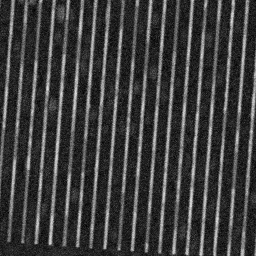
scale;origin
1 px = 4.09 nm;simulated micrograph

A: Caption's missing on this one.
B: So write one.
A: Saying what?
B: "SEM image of parallel lines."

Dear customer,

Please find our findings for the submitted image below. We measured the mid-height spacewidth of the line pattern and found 11.6 px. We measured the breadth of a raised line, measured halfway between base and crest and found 10.2 nm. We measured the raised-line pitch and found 0.0562 micrometres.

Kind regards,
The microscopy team